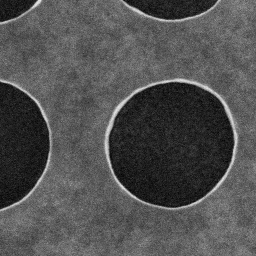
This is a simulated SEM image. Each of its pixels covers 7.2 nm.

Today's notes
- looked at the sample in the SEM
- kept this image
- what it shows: holes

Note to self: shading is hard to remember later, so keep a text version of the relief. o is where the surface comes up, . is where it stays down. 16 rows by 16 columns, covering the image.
..oooooo.....ooo
oooooooooooooooo
oooooooooooooooo
oooooooooooooooo
oooooooooooooooo
.oooooooo....ooo
..oooooo......oo
...oooo.......oo
...oooo........o
...oooo........o
...oooo.......oo
..oooooo......oo
.oooooooo...oooo
oooooooooooooooo
oooooooooooooooo
oooooooooooooooo